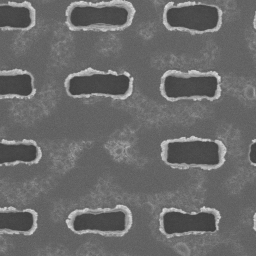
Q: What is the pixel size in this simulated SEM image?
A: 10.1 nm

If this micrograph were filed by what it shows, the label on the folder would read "holes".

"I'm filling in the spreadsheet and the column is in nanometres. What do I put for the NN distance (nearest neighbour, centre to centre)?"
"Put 690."